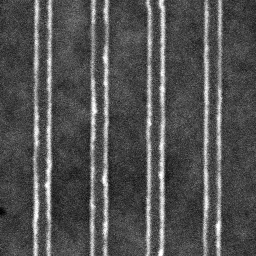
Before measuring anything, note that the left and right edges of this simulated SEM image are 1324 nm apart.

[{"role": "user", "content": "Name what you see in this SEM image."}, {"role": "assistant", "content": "parallel lines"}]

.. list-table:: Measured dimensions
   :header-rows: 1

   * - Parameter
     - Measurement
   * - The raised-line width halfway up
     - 81.5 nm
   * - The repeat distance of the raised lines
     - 293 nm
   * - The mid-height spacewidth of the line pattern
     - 41.5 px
